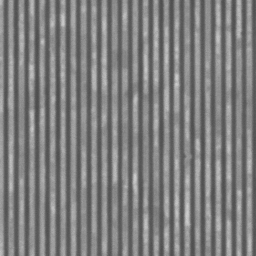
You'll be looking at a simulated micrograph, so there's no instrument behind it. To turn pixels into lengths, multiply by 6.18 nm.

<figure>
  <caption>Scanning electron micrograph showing parallel lines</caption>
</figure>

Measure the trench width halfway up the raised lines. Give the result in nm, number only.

40.2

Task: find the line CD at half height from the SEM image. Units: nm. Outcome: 26.3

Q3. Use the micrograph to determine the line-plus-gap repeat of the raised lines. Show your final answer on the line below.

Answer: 64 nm